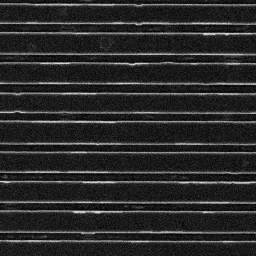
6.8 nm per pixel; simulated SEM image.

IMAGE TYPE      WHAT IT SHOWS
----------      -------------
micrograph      parallel lines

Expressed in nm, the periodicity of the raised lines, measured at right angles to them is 202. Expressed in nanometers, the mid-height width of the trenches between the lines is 57.8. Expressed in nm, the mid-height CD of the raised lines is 147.